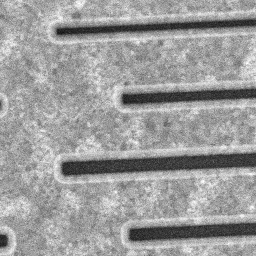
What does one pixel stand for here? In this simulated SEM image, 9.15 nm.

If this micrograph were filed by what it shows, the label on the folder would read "one or a few lines or trenches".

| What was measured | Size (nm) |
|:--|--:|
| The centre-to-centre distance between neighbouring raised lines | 628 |